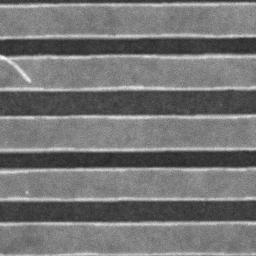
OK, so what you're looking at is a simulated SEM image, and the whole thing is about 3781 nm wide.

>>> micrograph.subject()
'lines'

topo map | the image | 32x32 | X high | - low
----------------------XXXXXXXXXX
XXXXXXXXXXXXXXXXXXXXXXXXXXXXXXXX
XXXXXXXXXXXXXXXXXXXXXXXXXXXXXXXX
XXXXXXXXXXXXXXXXXXXXXXXXXXXXXXXX
XXXXXXXXXXXXXXXXXXXXXXXXXXXXXXXX
--------------------------------
--------------------------------
XXXXXXXXXXXXXXXXXXXXXXXXXXXXXXXX
XXXXXXXXXXXXXXXXXXXXXXXXXXXXXXXX
XXXXXXXXXXXXXXXXXXXXXXXXXXXXXXXX
XXXXXXXXXXXXXXXXXXXXXXXXXXXXXXXX
--------------------------------
--------------------------------
--------------------------------
-----------------------------XXX
XXXXXXXXXXXXXXXXXXXXXXXXXXXXXXXX
XXXXXXXXXXXXXXXXXXXXXXXXXXXXXXXX
XXXXXXXXXXXXXXXXXXXXXXXXXXXXXXXX
XXXXXXXXXXXXXXXXXXXXXXXXXXXXXXXX
--------------------------------
--------------------------------
XXXXXXXXXXXXXXXXXXXXXXXXXXXXXXXX
XXXXXXXXXXXXXXXXXXXXXXXXXXXXXXXX
XXXXXXXXXXXXXXXXXXXXXXXXXXXXXXXX
XXXXXXXXXXXXXXXXXXXXXXXXXXXXXXXX
--------------------------------
--------------------------------
--------------------------------
XXXXXXXXXXXXXXXXXXXXXXXXXXXXXXXX
XXXXXXXXXXXXXXXXXXXXXXXXXXXXXXXX
XXXXXXXXXXXXXXXXXXXXXXXXXXXXXXXX
XXXXXXXXXXXXXXXXXXXXXXXXXXXXXXXX